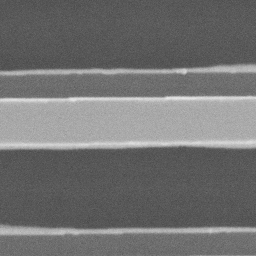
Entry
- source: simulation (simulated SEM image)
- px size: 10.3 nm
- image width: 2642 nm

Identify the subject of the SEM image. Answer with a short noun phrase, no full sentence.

lines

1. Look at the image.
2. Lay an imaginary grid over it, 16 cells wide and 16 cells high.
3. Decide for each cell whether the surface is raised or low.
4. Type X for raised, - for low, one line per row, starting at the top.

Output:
----------------
----------------
----------------
----------------
---------XXXXXXX
XXXXXXXXXXXXXXXX
XXXXXXXXXXXXXXXX
XXXXXXXXXXXXXXXX
XXXXXXXXXXXXXXXX
----------------
----------------
----------------
----------------
----------------
---------X-XXXXX
XXXXXXXXXXXXXXXX